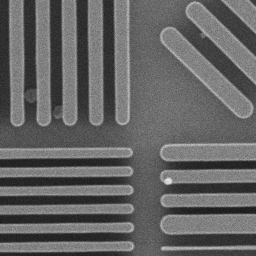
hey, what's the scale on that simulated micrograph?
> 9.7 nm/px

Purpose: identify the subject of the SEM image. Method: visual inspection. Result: groups of lines, slits or small figures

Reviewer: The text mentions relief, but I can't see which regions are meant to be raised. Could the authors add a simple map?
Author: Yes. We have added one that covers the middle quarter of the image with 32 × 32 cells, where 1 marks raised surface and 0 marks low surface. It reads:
11100011110001110000000000000011
11100011110001110000000000000000
11100011110001110000000000000000
11100011110001110000000000000000
11100011110001110000000000000000
11100011110001110000000000000000
11100011110001110000000000000000
11100011110001110000000000000000
11100011110001110000000000000000
11100011110001110000000000000000
11100011110001110000000000000000
11100011110001110000000000000000
11100011110001110000000000000000
11100001110001110000000000000000
11100001100001110000000000000000
00000000000000000000000000000000
00000000000000000000000000000000
00000000000000000000000000000000
00000000000000000000000000000000
00000000000000000000000000000000
00000000000000000000000001111111
11111111111111111000000011111111
11111111111111111000000011111111
00000000000000000000000001111111
00000000000000000000000000000000
00000000000000000000000000000000
11111111111111111000000000000000
11111111111111111000000011111111
00000000000000000000000011111111
00000000000000000000000001111111
01111111111111111000000000000000
11111111111111111000000000000000